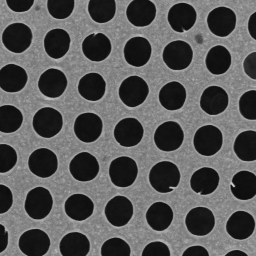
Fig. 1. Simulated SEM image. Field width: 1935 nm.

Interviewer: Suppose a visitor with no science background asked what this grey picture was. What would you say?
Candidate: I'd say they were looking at a regular array of holes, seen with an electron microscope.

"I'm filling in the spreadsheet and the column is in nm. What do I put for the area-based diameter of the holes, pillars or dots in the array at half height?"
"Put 220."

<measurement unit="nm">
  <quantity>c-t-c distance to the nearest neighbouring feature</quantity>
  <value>300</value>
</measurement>